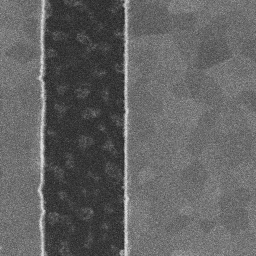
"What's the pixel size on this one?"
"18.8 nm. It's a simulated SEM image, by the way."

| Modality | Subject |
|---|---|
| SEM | one or a few lines or trenches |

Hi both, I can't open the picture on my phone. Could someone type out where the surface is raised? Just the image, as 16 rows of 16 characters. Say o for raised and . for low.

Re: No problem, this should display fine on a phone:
ooo.....oooooooo
ooo.....oooooooo
ooo.....oooooooo
ooo.....oooooooo
ooo.....oooooooo
ooo.....oooooooo
ooo.....oooooooo
ooo.....oooooooo
ooo.....oooooooo
ooo.....oooooooo
ooo.....oooooooo
ooo.....oooooooo
ooo.....oooooooo
ooo.....oooooooo
ooo.....oooooooo
ooo.....oooooooo